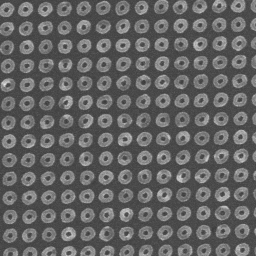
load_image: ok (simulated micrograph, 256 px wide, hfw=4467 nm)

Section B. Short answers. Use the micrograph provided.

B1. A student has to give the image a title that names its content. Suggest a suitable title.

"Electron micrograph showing a regular array of ring-shaped raised bodies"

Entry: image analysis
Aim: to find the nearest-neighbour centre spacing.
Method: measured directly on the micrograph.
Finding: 324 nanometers